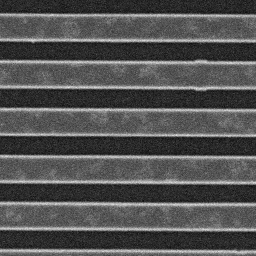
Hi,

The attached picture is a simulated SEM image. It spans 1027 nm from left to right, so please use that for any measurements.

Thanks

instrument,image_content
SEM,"parallel lines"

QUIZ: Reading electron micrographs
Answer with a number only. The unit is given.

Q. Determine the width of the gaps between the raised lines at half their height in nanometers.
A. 81.2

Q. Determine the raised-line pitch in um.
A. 0.189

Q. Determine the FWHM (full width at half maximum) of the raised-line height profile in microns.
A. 0.108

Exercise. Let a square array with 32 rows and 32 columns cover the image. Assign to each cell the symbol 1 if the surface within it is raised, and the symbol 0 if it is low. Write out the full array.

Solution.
00000000000000000000000000000000
00000000000000000000000000000000
11111111111111111111111111111111
11111111111111111111111111111111
11111111111111111111111111111111
00000000000000000000000000000000
00000000000000000000000000000000
00000000000000000000000000000000
11111111111111111111111111111111
11111111111111111111111111111111
11111111111111111111111111111111
00000000000000000000000000000000
00000000000000000000000000000000
00000000000000000000000000000000
11111111111111111111111111111111
11111111111111111111111111111111
11111111111111111111111111111111
00000000000000000000000000000000
00000000000000000000000000000000
11111111100000000000000000000000
11111111111111111111111111111111
11111111111111111111111111111111
11111111111111111111111111111111
00000000000000000000000000000000
00000000000000000000000000000000
11111111111111111111100111111111
11111111111111111111111111111111
11111111111111111111111111111111
11111111111111111111111111111111
00000000000000000000000000000000
00000000000000000000000000000000
11111111111111111111111111111111